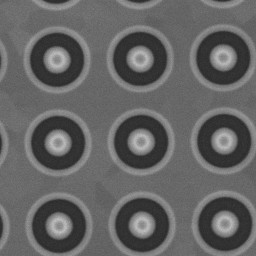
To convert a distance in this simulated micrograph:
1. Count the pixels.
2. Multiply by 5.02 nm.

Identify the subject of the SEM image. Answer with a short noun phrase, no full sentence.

an array of small figures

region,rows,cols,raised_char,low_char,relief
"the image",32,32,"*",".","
*****...********...********.****
********************************
********************************
********************************
*****....******.....*****.....**
****......****.......****......*
****..**...***...*...***...**...
***...**...***..***..***...**...
****..**...***...*...***.......*
****......****.......****......*
*****....*******...*******....**
********************************
********************************
********************************
******...*******...*******....**
****......*****......****......*
****.......***.......***....*...
.***..***..***..***..***...**...
.***..**...***...**..***...**...
****.......***.......****......*
*****.....*****.....******....**
******..************************
********************************
********************************
*****************..********..***
*****.....*****.....*****......*
****.......***.......****.......
.***..**...***...**..***...**...
.***..***..***...**..***...**...
.***.......***.......****.......
****......*****......****......*
******...*******...********...**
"